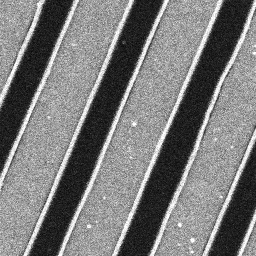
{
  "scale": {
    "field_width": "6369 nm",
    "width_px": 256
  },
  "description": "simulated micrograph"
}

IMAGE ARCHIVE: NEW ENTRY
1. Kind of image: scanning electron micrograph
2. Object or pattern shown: one or a few lines or trenches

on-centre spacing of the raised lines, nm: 2060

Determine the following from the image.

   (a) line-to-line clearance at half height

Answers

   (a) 1220 nm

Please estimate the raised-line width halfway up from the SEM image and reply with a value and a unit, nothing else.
32.9 px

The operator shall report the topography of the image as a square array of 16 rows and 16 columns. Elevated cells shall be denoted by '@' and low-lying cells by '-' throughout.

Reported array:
--@@@---@@----@@
--@@----@@---@@@
--@@---@@----@@-
-@@----@@---@@@-
-@@---@@@---@@--
@@@---@@---@@@--
@@---@@@---@@---
@@---@@----@@---
@----@@---@@@---
@---@@@---@@---@
----@@---@@@---@
---@@@---@@----@
---@@----@@---@@
---@@---@@@---@@
--@@----@@---@@@
--@@---@@@---@@-